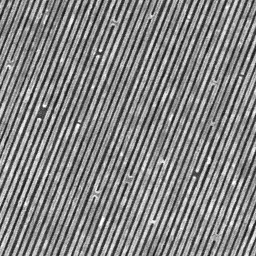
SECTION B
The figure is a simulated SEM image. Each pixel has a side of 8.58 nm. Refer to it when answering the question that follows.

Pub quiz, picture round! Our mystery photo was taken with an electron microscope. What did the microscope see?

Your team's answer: parallel lines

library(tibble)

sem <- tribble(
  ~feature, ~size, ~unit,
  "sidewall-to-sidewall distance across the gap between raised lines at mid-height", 22.9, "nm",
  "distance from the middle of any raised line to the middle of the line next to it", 54.7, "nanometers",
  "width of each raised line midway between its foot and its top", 31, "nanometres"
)